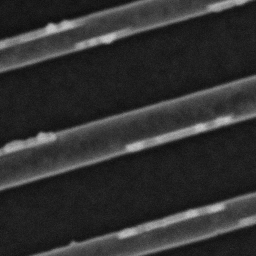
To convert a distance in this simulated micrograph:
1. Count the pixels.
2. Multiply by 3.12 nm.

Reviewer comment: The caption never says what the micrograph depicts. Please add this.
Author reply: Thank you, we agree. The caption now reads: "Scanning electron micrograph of one or a few lines or trenches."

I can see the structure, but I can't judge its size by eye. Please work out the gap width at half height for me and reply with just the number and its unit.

231 nm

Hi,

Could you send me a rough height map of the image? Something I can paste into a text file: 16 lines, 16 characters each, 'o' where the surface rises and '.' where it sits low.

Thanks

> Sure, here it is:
.......ooooooo..
...ooooooo......
ooooooo.........
ooo.............
................
.............ooo
..........oooooo
......ooooooooo.
..oooooooooo....
oooooooo........
ooooo...........
o...............
..............oo
...........ooooo
.......ooooooo..
....oooooo......